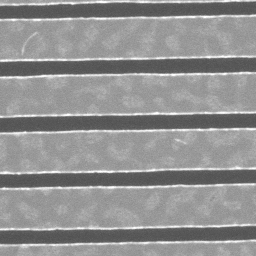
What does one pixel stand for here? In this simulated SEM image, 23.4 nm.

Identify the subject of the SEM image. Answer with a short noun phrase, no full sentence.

parallel lines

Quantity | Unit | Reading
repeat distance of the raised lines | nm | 1320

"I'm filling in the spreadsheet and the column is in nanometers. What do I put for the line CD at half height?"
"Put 964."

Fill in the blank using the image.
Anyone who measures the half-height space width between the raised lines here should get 352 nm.